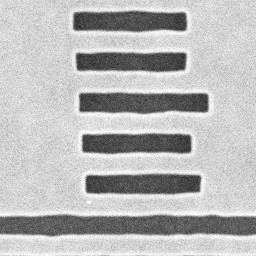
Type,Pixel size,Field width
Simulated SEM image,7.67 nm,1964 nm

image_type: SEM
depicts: groups of lines, slits or small figures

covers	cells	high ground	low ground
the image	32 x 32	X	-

XXXXXXXXXXXXXXXXXXXXXXXXXXXXXXXX
XXXXXXXXXX-------------XXXXXXXXX
XXXXXXXXX--------------XXXXXXXXX
XXXXXXXXX--------------XXXXXXXXX
XXXXXXXXXXXXXXXXXXXXXXXXXXXXXXXX
XXXXXXXXXXXXXXXXXXXXXXXXXXXXXXXX
XXXXXXXXXXXXX-XXXXXX--XXXXXXXXXX
XXXXXXXXX--------------XXXXXXXXX
XXXXXXXXXX-------------XXXXXXXXX
XXXXXXXXXXXXXXXXXXXXXXXXXXXXXXXX
XXXXXXXXXXXXXXXXXXXXXXXXXXXXXXXX
XXXXXXXXXXX-XX-XXXXXXXXXXXXXXXXX
XXXXXXXXXX----------------XXXXXX
XXXXXXXXXX----------------XXXXXX
XXXXXXXXXXXXXXXXXXXXXXXXXXXXXXXX
XXXXXXXXXXXXXXXXXXXXXXXXXXXXXXXX
XXXXXXXXXXXXXXXXXXXXXXXXXXXXXXXX
XXXXXXXXXX--------------XXXXXXXX
XXXXXXXXXX--------------XXXXXXXX
XXXXXXXXXXXXXXXXXXXXXXXXXXXXXXXX
XXXXXXXXXXXXXXXXXXXXXXXXXXXXXXXX
XXXXXXXXXXXXXXXXXXXXXXXXXXXXXXXX
XXXXXXXXXXX--------------XXXXXXX
XXXXXXXXXXX--------------XXXXXXX
XXXXXXXXXXXXXXXXXXXXXXXXXXXXXXXX
XXXXXXXXXXXXXXXXXXXXXXXXXXXXXXXX
XXXXXXXXXXXXXXXXXXXXXXXXXXXXXXXX
--------------------------------
--------------------------------
XXXXXX-XXXXXXXXXXXXXXXXXXXXXXX-X
XXXXXXXXXXXXXXXXXXXXXXXXXXXXXXXX
XXXXXXXXXXXXXXXXXXXXXXXXXXXXXXXX